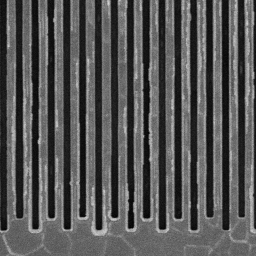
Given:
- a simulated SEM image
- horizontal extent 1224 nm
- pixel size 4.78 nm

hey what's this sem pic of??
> parallel lines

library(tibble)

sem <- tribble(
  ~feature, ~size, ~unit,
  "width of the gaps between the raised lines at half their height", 33.5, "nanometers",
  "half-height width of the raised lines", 41.8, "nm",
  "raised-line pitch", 75.9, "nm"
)